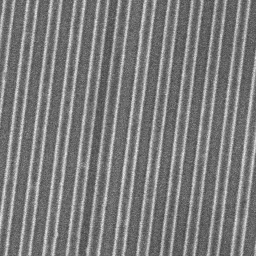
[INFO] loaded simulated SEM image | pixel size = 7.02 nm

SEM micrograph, parallel lines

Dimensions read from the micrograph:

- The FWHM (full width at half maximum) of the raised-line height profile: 74.9 nanometres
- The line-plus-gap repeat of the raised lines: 164 nm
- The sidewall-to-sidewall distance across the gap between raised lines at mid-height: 0.0888 um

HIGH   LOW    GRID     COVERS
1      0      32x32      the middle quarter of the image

01100001100011100011100011100011
01100011100011000011100011000011
11100011100111000011000011000011
11100011100111000011000011000011
11100011100111000011000011000011
11100011100111000011000011000011
11100011000111000011000011000111
11000011000111000111000111000111
11000011000111000111000111000111
11000111000110000111000110000110
11000111000110000110000110000110
11000111001110000110000110000110
11000111001110000110000110000110
11000111001110000110000110000110
11000110001110000110000110001110
10000110001110000110001110001110
10000110001110001110001110001110
10001110001100001110001100001100
10001110001100001100001100001100
10001110011100001100001100001100
10001110011100001100001100001100
10001110011100001100001100001100
10001100011100001100001100011100
00001100011100001100011100011100
00001100011100011100011100011000
00011100011000011100011100011000
00011100011000011000011100011000
00011100111000011000011000011000
00011100111000011000011000011000
00011100111000011000011000011000
00011000111000011000011000111000
00011000111000011000111000111000